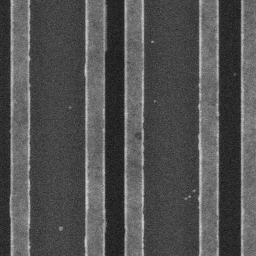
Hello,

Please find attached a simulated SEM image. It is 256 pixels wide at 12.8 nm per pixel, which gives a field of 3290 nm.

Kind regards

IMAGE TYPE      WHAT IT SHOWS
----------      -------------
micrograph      lines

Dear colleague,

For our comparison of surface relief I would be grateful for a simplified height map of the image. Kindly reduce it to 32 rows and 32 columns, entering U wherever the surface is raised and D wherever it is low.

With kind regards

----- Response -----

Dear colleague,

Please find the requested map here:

DUUUDDDDDDDUUDDDUUDDDDDDDUUDDDUU
DUUUDDDDDDDUUDDDUUDDDDDDDUUDDDUU
DUUUDDDDDDDUUDDDUUDDDDDDDUUDDDUU
DUUUDDDDDDDUUDDDUUDDDDDDDUUDDDUU
DUUUDDDDDDDUUDDDUUDDDDDDDUUDDDUU
DUUUDDDDDDDUUDDDUUDDDDDDDUUDDDUU
DUUUDDDDDDDUUDDDUUDDDDDDDUUDDDUU
DUUUDDDDDDDUUDDDUUDDDDDDDUUDDDUU
DUUUDDDDDDDUUDDDUUDDDDDDDUUDDDUU
DUUUDDDDDDDUUDDDUUDDDDDDDUUDDDUU
DUUUDDDDDDDUUDDDUUDDDDDDDUUDDDUU
DUUUDDDDDDDUUDDDUUDDDDDDDUUDDDUU
DUUUDDDDDDDUUDDDUUDDDDDDDUUDDDUU
DUUUDDDDDDDUUDDDUUDDDDDDDUUDDDUU
DUUUDDDDDDDUUDDDUUDDDDDDDUUDDDUU
DUUUDDDDDDDUUDDDUUDDDDDDDUUDDDUU
DUUUDDDDDDDUUDDDUUDDDDDDDUUDDDUU
DUUUDDDDDDDUUDDDUUDDDDDDDUUDDDUU
DUUUDDDDDDDUUDDDUUDDDDDDDUUDDDUU
DUUUDDDDDDDUUDDDUUDDDDDDDUUDDDUU
DUUUDDDDDDDUUDDDUUDDDDDDDUUDDDUU
DUUUDDDDDDDUUDDDUUDDDDDDDUUDDDUU
DUUUDDDDDDDUUDDDUUDDDDDDDUUDDDUU
DUUUDDDDDDDUUDDDUUDDDDDDDUUDDDUU
DUUUDDDDDDDUUDDDUUDDDDDDDUUDDDUU
DUUUDDDDDDDUUDDDUUDDDDDDDUUDDDUU
DUUUDDDDDDDUUDDDUUDDDDDDDUUDDDUU
DUUUDDDDDDDUUDDDUUDDDDDDDUUDDDUU
DUUUDDDDDDDUUDDDUUDDDDDDDUUDDDUU
DUUUDDDDDDDUUDDDUUDDDDDDDUUDDDUU
DUUUDDDDDDDUUDDDUUDDDDDDDUUDDDUU
DUUUDDDDDDDUUDDDUUDDDDDDDUUDDDUU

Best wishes